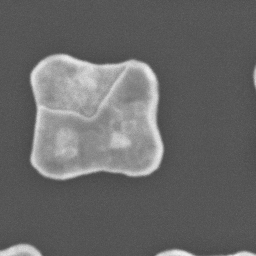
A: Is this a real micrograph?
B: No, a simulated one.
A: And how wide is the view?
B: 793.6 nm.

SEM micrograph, raised bodies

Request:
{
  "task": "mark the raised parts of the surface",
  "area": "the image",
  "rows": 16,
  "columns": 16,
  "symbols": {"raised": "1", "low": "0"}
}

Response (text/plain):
0000000000000000
0000000000000000
0000000000000000
0000000000000000
0011111110000000
0011111111000000
0011111111000000
0011111110000000
0011111111000000
0011111111000000
0011111110000000
0000000000000000
0000000000000000
0000000000000000
0000000000000000
0000000000000000